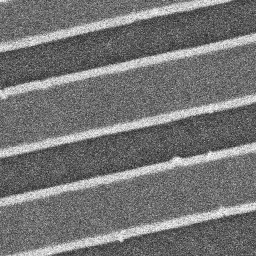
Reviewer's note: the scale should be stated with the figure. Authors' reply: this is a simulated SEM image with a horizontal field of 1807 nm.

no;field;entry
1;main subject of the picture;one or a few lines or trenches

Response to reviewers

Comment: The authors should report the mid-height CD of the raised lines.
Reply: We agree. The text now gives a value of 0.413 µm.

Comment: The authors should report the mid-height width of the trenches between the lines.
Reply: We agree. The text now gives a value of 323 nanometres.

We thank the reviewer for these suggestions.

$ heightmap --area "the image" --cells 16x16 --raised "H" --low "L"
HHHHHHHHHHHLLLLL
HHHHHHHLLLLLLLLL
HHLLLLLLLLLLLLLH
LLLLLLLLLLLHHHHH
LLLLLLHHHHHHHHHH
LHHHHHHHHHHHHHHH
HHHHHHHHHHHHHHLL
HHHHHHHHHHLLLLLL
HHHHHLLLLLLLLLLL
HLLLLLLLLLLLLLLH
LLLLLLLLLLHHHHHH
LLLLLHHHHHHHHHHH
LHHHHHHHHHHHHHHH
HHHHHHHHHHHHHLLL
HHHHHHHHLLLLLLLL
HHHHLLLLLLLLLLLL